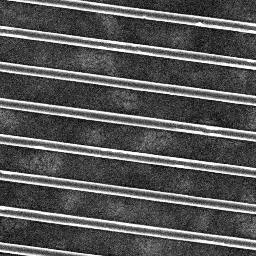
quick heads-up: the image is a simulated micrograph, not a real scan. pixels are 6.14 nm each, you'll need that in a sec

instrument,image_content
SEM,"parallel lines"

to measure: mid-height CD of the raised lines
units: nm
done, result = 54.8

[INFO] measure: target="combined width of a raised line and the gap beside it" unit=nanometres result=220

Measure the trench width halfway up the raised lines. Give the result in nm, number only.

166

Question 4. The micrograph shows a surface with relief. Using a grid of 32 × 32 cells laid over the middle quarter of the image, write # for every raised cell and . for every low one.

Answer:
................................
................................
######..........................
############....................
.......##############...........
............################....
....................############
...........................#####
................................
................................
................................
#####...........................
############....................
....################............
............###############.....
...................#############
..........................######
................................
................................
................................
####............................
############....................
.....##############.............
.............##############.....
....................############
...........................#####
................................
................................
................................
#####...........................
#############...................
....################............